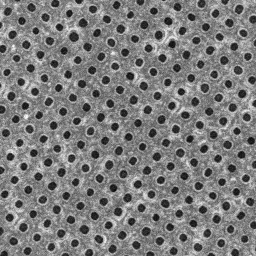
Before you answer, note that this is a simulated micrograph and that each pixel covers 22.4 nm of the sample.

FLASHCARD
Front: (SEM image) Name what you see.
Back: a regular array of holes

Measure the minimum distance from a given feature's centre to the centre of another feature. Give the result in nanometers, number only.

372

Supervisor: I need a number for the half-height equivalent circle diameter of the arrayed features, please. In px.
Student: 8.74